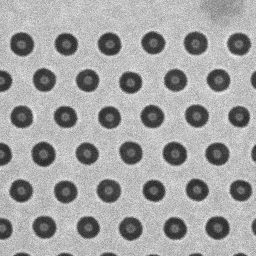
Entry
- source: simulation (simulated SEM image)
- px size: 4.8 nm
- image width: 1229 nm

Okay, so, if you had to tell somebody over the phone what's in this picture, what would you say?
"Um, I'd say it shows a regular array of ring-shaped grooves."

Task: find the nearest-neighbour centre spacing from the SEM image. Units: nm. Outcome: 201